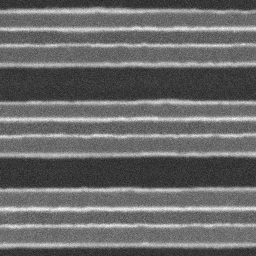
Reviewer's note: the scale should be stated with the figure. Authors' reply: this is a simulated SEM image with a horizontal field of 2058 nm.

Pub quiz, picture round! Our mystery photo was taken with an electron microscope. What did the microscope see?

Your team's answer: lines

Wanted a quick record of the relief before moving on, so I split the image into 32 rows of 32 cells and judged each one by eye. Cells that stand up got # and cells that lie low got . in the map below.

................................
################################
################################
################################
################################
################################
################################
################################
................................
................................
................................
................................
................................
################################
################################
################################
################################
################################
################################
................................
................................
................................
................................
................................
################################
################################
################################
################################
################################
################################
################################
................................